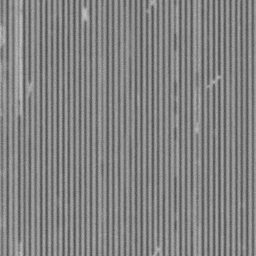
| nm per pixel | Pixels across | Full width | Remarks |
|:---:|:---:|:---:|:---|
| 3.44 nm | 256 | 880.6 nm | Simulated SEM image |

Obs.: parallel lines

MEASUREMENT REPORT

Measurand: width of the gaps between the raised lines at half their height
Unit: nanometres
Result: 6.4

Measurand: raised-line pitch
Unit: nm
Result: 19.1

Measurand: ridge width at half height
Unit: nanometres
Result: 13.3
